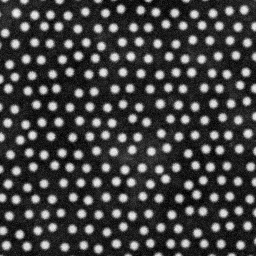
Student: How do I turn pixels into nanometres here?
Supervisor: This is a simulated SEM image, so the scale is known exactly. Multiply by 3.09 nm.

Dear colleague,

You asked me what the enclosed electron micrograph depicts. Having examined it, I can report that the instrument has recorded a regular array of raised bodies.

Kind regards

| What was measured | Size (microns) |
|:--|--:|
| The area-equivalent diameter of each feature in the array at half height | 0.0252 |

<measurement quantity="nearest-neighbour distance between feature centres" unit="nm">46.8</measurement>